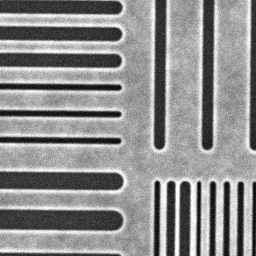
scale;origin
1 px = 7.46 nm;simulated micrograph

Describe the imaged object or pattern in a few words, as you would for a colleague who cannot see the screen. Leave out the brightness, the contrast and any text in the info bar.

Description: groups of lines, slits or small figures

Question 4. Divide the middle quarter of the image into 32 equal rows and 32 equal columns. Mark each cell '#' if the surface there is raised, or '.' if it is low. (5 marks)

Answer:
..............#########...######
#######################...######
#######################...######
#######################...######
#######################...######
..............#########...######
..............########....######
######################....######
######################....######
######################....######
######################....######
......################....######
..............########....######
##...........#########....######
######################....######
######################....######
######################....######
######################....######
..............########....######
..............########....######
#######################..#######
################################
################################
################################
################################
################################
################################
..............##################
...............#################
...............########.##..#..#
...............########.##..#...
.............##########.##..#...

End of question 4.